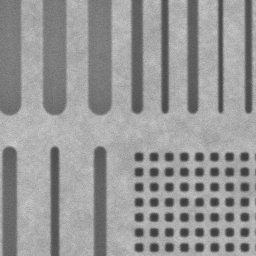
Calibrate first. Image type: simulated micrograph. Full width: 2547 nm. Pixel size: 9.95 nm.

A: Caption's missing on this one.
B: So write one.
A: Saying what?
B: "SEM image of groups of lines, slits or small figures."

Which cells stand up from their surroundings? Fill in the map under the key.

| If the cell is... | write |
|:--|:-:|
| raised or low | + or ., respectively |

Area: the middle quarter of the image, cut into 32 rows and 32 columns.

.+++++......+++++...++++..+++++.
.+++++......+++++...++++..+++++.
.+++++......+++++...++++..+++++.
.+++++......+++++...++++..+++++.
.+++++......+++++...++++..+++++.
.+++++......+++++...++++..+++++.
.+++++......+++++...++++..+++++.
.+++++......+++++...++++..+++++.
.+++++......+++++...++++..+++++.
.+++++......+++++...++++..+++++.
.+++++......+++++...++++..+++++.
++++++......+++++...++++..+++++.
++++++++..++++++++++++++++++++++
++++++++++++++++++++++++++++++++
++++++++++++++++++++++++++++++++
++++++++++++++++++++++++++++++++
++++++++++++++++++++++++++++++++
++++++++++++++++++++++++++++++++
++++++++++++++++++++++++++++++++
++++++++++++++++++++++++++++++++
++++++++++++++++++++++++++++++++
++++++++..++++++++++++++++++++++
+++++++....+++++++..+..++..++..+
+++++++....++++++...+...+..++..+
+++++++....+++++++.+++.+++.+++.+
+++++++....+++++++++++++++++++++
+++++++....+++++++..+...+..++..+
+++++++....+++++++..+...+..++..+
+++++++....+++++++++++++++++++++
+++++++....+++++++++++++++++++++
+++++++....+++++++..+...+..++..+
+++++++....+++++++..+..++..++..+